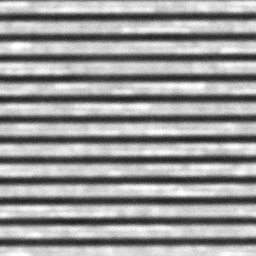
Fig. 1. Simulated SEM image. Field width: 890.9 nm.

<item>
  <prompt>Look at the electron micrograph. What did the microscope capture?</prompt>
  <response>parallel lines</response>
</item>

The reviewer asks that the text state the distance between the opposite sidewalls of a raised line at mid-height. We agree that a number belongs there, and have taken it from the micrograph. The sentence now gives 0.0344 microns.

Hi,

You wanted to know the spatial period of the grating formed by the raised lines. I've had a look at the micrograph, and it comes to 71.1 nanometres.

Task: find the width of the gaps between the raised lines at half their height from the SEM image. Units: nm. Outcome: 37.4